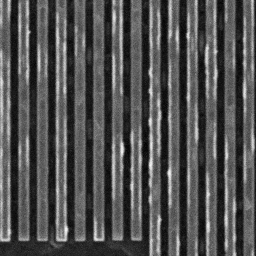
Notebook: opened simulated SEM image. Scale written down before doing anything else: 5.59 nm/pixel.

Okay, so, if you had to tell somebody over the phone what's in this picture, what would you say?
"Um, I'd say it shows parallel lines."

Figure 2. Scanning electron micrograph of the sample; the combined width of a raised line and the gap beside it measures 105 nm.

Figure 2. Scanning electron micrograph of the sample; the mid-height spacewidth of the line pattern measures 48.9 nm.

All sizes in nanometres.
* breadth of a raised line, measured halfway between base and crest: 54.5